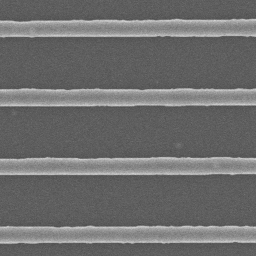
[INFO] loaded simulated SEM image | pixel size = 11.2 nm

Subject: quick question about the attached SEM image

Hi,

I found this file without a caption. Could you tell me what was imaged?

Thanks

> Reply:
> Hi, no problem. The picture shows lines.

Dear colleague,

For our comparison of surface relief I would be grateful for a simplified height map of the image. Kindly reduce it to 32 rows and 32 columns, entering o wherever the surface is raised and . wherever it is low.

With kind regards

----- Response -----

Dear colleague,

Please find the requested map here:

................................
................................
......................o.......oo
oooooooooooooooooooooooooooooooo
ooooooooooooooooooo...oooooo....
................................
................................
................................
................................
................................
................................
oooooooooooooooooooooooooooooooo
oooooooooooooooooooooooooooooooo
................................
................................
................................
................................
................................
................................
................................
oooooooooooooooooooooooooooooooo
oooooooooooooooooooooooooooooooo
................................
................................
................................
................................
................................
................................
oooooooooooooooooooooooooooooooo
oooooooooooooooooooooooooooooooo
................................
................................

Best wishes